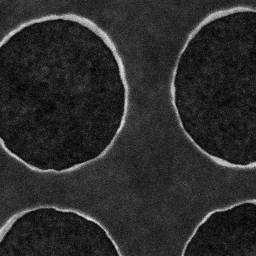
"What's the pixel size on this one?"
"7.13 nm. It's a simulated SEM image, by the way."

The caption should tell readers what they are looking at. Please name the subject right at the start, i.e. holes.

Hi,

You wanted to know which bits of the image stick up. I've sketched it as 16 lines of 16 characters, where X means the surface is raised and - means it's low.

XXXXXXXXXXXXXXXX
XX---XXXXXXXX---
-------XXXXX----
-------XXXX-----
--------XXX-----
--------XXX-----
--------XXX-----
--------XXX-----
-------XXXXX----
X------XXXXXX---
XX--XXXXXXXXXXXX
XXXXXXXXXXXXXXXX
XXXXXXXXXXXXXXXX
X----XXXXXXXX---
-------XXXXX----
-------XXXXX----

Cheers